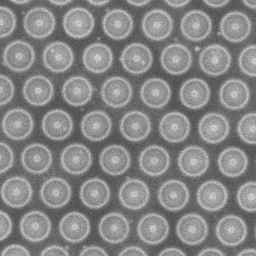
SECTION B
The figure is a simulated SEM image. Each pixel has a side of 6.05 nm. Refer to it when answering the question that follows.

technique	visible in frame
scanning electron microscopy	an array of small figures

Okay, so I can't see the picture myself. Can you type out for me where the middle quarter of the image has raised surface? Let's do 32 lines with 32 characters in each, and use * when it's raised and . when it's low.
.*****.....****......****......*
*******...******....******....**
********************************
********************************
*.....*****....******....******.
......****......****......****..
...*...***......****......****..
......****......****..*...***...
......****......****......****..
*....******....******....*****..
**********************..********
********************************
*******..********..********.****
.****......****.....*****.....**
..***......****......****......*
..***..**..***...*...***...*...*
.****......****......***.......*
.*****.....****.....*****......*
*******..*******...*******....**
********************************
***.****************************
*....******....******....******.
......****......****.....*****..
......***...*...***.......***...
......***...*...***...*...***...
......****......****......***...
*....******....*****.....*****..
**********************.********.
********************************
******...********..********.****
.****.....*****.....*****.....**
.****......***.......***......**